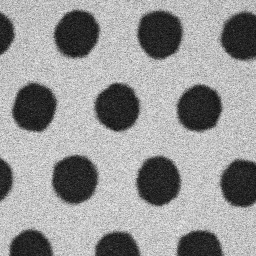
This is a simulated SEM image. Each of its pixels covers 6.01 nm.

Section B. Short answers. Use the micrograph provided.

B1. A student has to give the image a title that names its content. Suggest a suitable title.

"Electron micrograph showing holes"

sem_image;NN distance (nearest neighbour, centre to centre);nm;494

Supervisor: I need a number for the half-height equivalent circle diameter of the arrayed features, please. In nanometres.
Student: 278